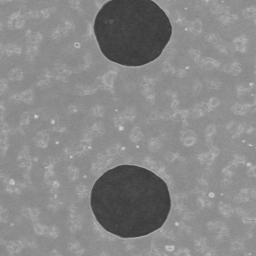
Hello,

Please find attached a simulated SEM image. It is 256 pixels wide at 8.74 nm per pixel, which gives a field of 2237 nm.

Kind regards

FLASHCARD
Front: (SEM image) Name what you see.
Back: holes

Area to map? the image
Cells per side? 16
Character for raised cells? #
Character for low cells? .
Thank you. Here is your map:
######....######
######.....#####
######.....#####
#######...######
################
################
################
################
################
################
#######..#######
######....######
######.....#####
######....######
#######...######
################